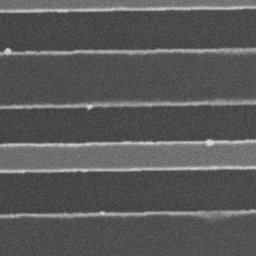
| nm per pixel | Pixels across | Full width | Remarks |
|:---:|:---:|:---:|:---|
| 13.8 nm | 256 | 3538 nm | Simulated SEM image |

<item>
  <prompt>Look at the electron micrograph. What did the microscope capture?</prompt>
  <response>lines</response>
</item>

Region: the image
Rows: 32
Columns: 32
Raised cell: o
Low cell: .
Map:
oooooooooooooooooooooooooooooooo
................................
................................
................................
................................
................................
oo.......ooooooooooooooooooooooo
oooooooooooooooooooooooooooooooo
oooooooooooooooooooooooooooooooo
oooooooooooooooooooooooooooooooo
oooooooooooooooooooooooooooooooo
oooooooooooooooooooooooooooooooo
oooooooooooooooooooooooooooooooo
o...............................
................................
................................
................................
................................
oooooooooooooooooooooooooooooooo
oooooooooooooooooooooooooooooooo
oooooooooooooooooooooooooooooooo
................................
................................
................................
................................
................................
...............................o
oooooooooooooooooooooooooooooooo
oooooooooooooooooooooooooooooooo
oooooooooooooooooooooooooooooooo
oooooooooooooooooooooooooooooooo
oooooooooooooooooooooooooooooooo